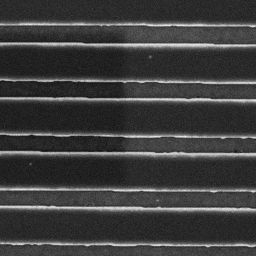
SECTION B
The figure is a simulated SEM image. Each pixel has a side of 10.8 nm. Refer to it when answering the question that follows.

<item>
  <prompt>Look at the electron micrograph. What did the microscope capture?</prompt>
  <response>lines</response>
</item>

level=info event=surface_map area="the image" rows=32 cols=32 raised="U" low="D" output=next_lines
UUUUUUUUUUUUUUUUUUUUUUUUUUUUUUUU
UUUUUUUUUUUUUUUUUUUUUUUUUUUUUUUU
UUUUUUUUUUUUUUUUUUUUUUUUUUUUUUUU
DDDDDDDDDDDDDDDDDDDDDDDDDDDDDDDD
DDDDDDDDDDDDDDDDDDDDDDDDDDDDDDDD
UUUUUUUUUUDDDDDDDDDDDDDDDDDDDDDD
UUUUUUUUUUUUUUUUUUUUUUUUUUUUUUUU
UUUUUUUUUUUUUUUUUUUUUUUUUUUUUUUU
UUUUUUUUUUUUUUUUUUUUUUUUUUUUUUUU
UUUUUUUUUUUUUUUUUUUUUUUUUUUUUUUU
DDDDDDDDDDDDDDDDDDDDDDDDDDDDDDDD
DDDDDDDDDDDDDDDDDDDDDDDDDDDDDDDD
UUUUUUUUUUUUUUUUUUUUUUUUUUUUUUUU
UUUUUUUUUUUUUUUUUUUUUUUUUUUUUUUU
UUUUUUUUUUUUUUUUUUUUUUUUUUUUUUUU
UUUUUUUUUUUUUUUUUUUUUUUUUUUUUUUU
UUUUUUUUUUUUUUUUUUUUUUUUUUUUUUUU
DDDDDDDDDDDDDDDDDDDDDDDDDDDDDDDD
DDDDDDDDDDDDDDDDDDDDDDDDDDDDDDDD
UUUUUUUUUUUUUUUUUUUUUUUUUUUUUUUU
UUUUUUUUUUUUUUUUUUUUUUUUUUUUUUUU
UUUUUUUUUUUUUUUUUUUUUUUUUUUUUUUU
UUUUUUUUUUUUUUUUUUUUUUUUUUUUUUUU
UUUUUUUUUUUUUUUUUUUUUUUUUUUUUUUU
DDDDDDDDDDDDDDDDDDDDDDDDDDDDDDDD
DDDDDDDDDDDDDDDDDDDDDDDDDDDDDDDD
UUUUUUUUUUUUUUUUUUUUUUUUUUUUUUUU
UUUUUUUUUUUUUUUUUUUUUUUUUUUUUUUU
UUUUUUUUUUUUUUUUUUUUUUUUUUUUUUUU
UUUUUUUUUUUUUUUUUUUUUUUUUUUUUUUU
DUUDDDUUUUUUUUUUUUUUUUUUUUUUUUUU
DDDDDDDDDDDDDDDDDDDDDDDDDDDDDDDD